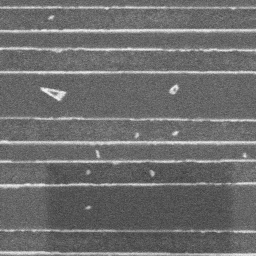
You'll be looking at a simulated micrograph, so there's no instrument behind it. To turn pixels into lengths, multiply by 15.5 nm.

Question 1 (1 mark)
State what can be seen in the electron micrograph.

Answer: lines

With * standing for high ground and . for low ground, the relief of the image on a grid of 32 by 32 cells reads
********************************
................................
................................
................................
********************************
********************************
................................
................................
................................
********************************
********************************
********************************
********************************
********************************
********************************
................................
................................
................................
********************************
********************************
................................
................................
................................
********************************
********************************
********************************
********************************
********************************
********************************
................................
................................
................................